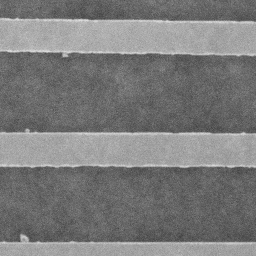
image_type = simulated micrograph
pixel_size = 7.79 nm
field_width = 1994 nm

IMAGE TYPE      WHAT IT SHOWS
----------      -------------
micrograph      lines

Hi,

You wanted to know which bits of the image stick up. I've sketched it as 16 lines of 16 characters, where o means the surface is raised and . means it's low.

................
oooooooooooooooo
oooooooooooooooo
................
................
................
................
................
oooooooooooooooo
oooooooooooooooo
................
................
................
................
................
oooooooooooooooo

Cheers